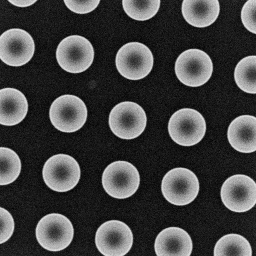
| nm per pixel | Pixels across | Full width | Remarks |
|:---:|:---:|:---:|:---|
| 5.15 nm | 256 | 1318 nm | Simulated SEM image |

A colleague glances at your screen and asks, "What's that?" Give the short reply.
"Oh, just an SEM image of an array of small figures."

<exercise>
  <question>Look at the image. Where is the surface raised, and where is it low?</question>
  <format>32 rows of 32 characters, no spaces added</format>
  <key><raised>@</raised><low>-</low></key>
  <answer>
--@@----@@@@---@@@@@---@@@@----@
---------@@-----@@@@---@@@@---@@
-----------------@-----@@@@---@@
-------------------------------@
@@@@-----@----------------------
@@@@---@@@@-----@@--------------
@@@@---@@@@@---@@@@----@@@------
@@@@---@@@@@--@@@@@---@@@@----@@
--------@@@----@@@@---@@@@@--@@@
---------------@@@----@@@@---@@@
-----------------------@@-----@@
@@@----------------------------@
@@@----@@@----------------------
@@@---@@@@@---@@@@--------------
@@@---@@@@@---@@@@---@@@@-----@-
@@-----@@@----@@@@---@@@@@---@@@
--------@-----@@@@---@@@@@--@@@@
----------------------@@@----@@@
@----------------------------@@@
@@-----@@-----------------------
@@@---@@@@----@@----------------
@@@--@@@@@---@@@@----@@@--------
@@---@@@@@---@@@@---@@@@@---@@@@
------@@@----@@@@---@@@@@---@@@@
--------------@@----@@@@@---@@@@
----------------------@-----@@@@
@-------------------------------
@@---@@@@-----------------------
@@---@@@@---@@@@-----@----------
@----@@@@---@@@@@---@@@@----@@--
-----@@@@---@@@@@--@@@@@---@@@@-
-------------@@@---@@@@@---@@@@-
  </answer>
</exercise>